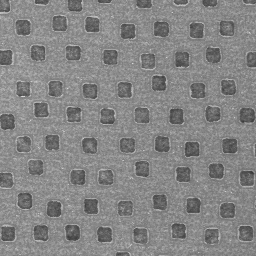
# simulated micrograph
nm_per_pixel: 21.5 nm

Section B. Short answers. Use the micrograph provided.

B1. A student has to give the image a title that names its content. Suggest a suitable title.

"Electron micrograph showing a regular array of holes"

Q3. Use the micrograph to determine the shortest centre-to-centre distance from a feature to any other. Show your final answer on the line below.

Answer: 637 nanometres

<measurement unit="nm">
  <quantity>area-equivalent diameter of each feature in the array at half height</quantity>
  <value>360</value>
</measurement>